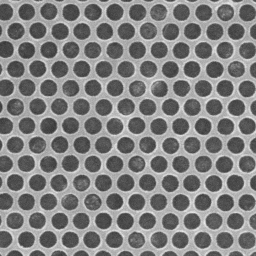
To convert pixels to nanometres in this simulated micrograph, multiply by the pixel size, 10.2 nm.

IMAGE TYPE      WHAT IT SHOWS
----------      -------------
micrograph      a regular array of holes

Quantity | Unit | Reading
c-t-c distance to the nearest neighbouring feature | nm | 219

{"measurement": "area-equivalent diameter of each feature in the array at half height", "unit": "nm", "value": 182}